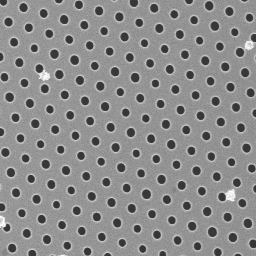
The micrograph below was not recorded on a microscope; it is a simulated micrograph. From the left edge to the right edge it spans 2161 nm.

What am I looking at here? a regular array of holes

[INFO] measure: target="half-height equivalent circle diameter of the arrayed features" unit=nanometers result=68.7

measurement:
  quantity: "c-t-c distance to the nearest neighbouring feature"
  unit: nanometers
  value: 173